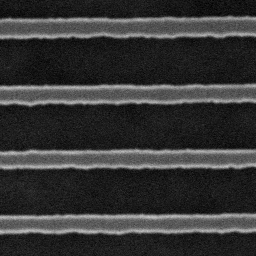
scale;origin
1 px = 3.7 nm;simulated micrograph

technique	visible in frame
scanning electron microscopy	lines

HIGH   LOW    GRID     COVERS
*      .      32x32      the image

................................
................................
********************************
********************************
************.****************.**
................................
................................
................................
................................
................................
................................
********************************
********************************
................................
................................
................................
................................
................................
................................
********************************
********************************
................................
................................
................................
................................
................................
................................
********************************
********************************
................................
................................
................................